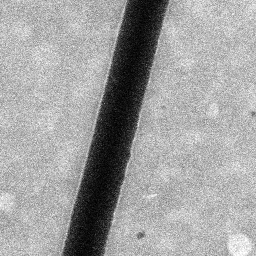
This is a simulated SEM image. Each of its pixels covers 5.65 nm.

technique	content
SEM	one or a few lines or trenches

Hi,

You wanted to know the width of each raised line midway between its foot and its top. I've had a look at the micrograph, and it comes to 236 nanometers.